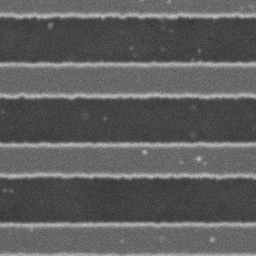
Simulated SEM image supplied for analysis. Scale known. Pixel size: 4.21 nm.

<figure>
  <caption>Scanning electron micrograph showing lines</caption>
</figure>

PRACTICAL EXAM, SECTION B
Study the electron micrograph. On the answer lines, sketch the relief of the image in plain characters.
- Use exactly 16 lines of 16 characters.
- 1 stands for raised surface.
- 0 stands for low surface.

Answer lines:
1111111111111111
0000000000000000
0000000000000000
0000000000000000
1111111111111111
1111111111111111
0000000000000000
0000000000000000
0000000000000000
1111111111111111
1111111111111111
0000000000000000
0000000000000000
0000000000000000
1111111111111111
1111111111111111